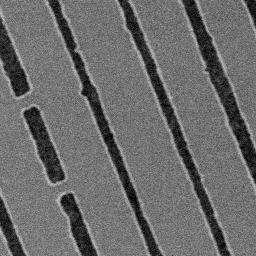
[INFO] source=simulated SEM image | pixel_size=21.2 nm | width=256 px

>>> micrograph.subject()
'one or a few lines or trenches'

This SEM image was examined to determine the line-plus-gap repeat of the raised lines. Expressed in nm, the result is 1320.